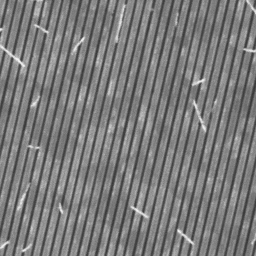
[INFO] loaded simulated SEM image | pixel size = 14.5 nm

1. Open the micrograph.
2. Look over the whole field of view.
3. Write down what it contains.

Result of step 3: parallel lines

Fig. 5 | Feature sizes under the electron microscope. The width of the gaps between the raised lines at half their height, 49.5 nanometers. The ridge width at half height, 74.3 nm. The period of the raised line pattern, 130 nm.